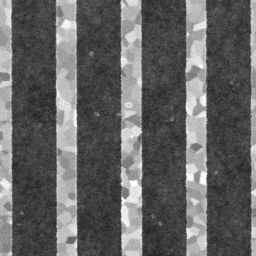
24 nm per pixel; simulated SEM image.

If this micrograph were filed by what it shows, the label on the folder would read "one or a few lines or trenches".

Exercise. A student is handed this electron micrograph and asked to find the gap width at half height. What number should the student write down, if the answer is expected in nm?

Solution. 1090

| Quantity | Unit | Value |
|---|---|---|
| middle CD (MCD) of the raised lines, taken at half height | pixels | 19.6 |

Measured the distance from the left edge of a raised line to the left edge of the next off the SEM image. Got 1.56 um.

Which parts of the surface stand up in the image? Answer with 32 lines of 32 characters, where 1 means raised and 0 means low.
10000001100000011100000111000001
10000001100000011100000111000001
10000001100000011100000111000001
10000001100000011100000111000001
10000001100000011100000111000001
10000001100000011100000111000001
10000001100000011100000111000001
10000001100000011100000111000001
10000001100000011100000111000001
10000001100000011100000111000001
10000001100000011100000111000001
10000001110000011100000111000000
10000001100000011100000111000001
10000001100000011100000111000001
10000001100000011100000111000001
10000001100000011100000111000001
10000001100000011100000111000001
10000001100000011100000111000001
10000001100000011100000111000001
10000001100000011100000111000001
10000001100000011100000111000001
10000001110000011100000111000001
10000001110000011100000111000001
10000001110000011100000111000001
10000001110000011100000111000001
10000001110000011100000111000001
10000001110000011100000111000001
10000001110000011100000111000001
10000001110000011100000111000001
10000001110000011100000111000001
10000001110000011100000111000001
10000001110000011100000111000001